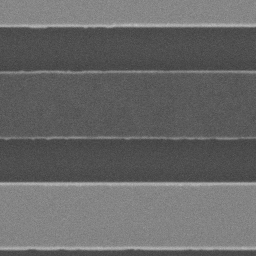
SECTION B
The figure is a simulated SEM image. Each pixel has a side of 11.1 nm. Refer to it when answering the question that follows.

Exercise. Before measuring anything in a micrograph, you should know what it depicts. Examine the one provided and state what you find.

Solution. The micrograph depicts lines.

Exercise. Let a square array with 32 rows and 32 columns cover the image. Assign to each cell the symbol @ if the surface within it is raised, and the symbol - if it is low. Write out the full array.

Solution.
@@@@@@@@@@@@@@@@@@@@@@@@@@@@@@@@
@@@@@@@@@@@@@@@@@@@@@@@@@@@@@@@@
@@@@@@@@@@@@@@@@@@@@@@@@@@@@@@@@
--------------------------------
--------------------------------
--------------------------------
--------------------------------
--------------------------------
--------------------------------
@@@@@@@@@@@@@@@@@@@@@@@@@@@@@@@@
@@@@@@@@@@@@@@@@@@@@@@@@@@@@@@@@
@@@@@@@@@@@@@@@@@@@@@@@@@@@@@@@@
@@@@@@@@@@@@@@@@@@@@@@@@@@@@@@@@
@@@@@@@@@@@@@@@@@@@@@@@@@@@@@@@@
@@@@@@@@@@@@@@@@@@@@@@@@@@@@@@@@
@@@@@@@@@@@@@@@@@@@@@@@@@@@@@@@@
@@@@@@@@@@@@@@@@@@@@@@@@@@@@@@@@
--------------------------------
--------------------------------
--------------------------------
--------------------------------
--------------------------------
--------------------------------
@@@@@@@@@@@@@@@@@@@@@@@@@@@@@@@@
@@@@@@@@@@@@@@@@@@@@@@@@@@@@@@@@
@@@@@@@@@@@@@@@@@@@@@@@@@@@@@@@@
@@@@@@@@@@@@@@@@@@@@@@@@@@@@@@@@
@@@@@@@@@@@@@@@@@@@@@@@@@@@@@@@@
@@@@@@@@@@@@@@@@@@@@@@@@@@@@@@@@
@@@@@@@@@@@@@@@@@@@@@@@@@@@@@@@@
@@@@@@@@@@@@@@@@@@@@@@@@@@@@@@@@
--------------------------------